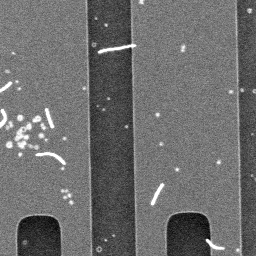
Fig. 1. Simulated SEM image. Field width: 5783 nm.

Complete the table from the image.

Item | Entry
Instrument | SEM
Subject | groups of lines, slits or small figures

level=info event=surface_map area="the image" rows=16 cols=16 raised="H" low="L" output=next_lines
HHHHHLLLHHHHHHHL
HHHHHLLLHHHHHHHL
HHHHHLLLHHHHHHHL
HHHHHLLLHHHHHHHL
HHHHHHLLHHHHHHHL
HHHHHHLLHHHHHHHL
HHHHHHLLHHHHHHHL
HHHHHHLLHHHHHHHL
HHHHHHLLHHHHHHHL
HHHHHHLLHHHHHHHL
HHHHHHLLHHHHHHHL
HHHHHHLLHHHHHHHL
HHHHHHLLHHHHHHHL
HHLHHHLLLHHLLHHL
HLLLHHLLLHLLLHHL
HLLLHHLLLHLLLHHL